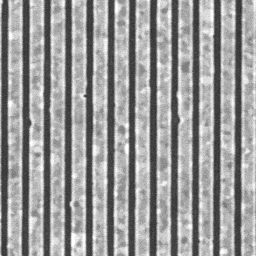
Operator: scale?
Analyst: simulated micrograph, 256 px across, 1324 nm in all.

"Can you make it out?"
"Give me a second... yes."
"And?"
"parallel lines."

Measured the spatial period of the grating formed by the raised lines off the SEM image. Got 0.11 micrometres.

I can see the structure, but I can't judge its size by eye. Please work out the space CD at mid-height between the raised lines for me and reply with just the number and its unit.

0.0446 um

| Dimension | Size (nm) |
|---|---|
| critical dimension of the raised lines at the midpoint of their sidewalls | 64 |